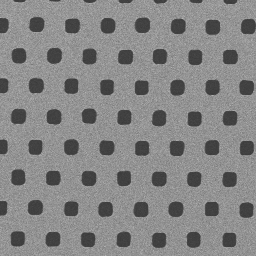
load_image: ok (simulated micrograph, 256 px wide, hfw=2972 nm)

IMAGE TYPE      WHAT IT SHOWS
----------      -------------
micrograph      a regular array of holes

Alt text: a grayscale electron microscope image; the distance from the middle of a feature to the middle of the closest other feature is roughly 400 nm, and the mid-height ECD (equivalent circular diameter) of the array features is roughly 15.8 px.